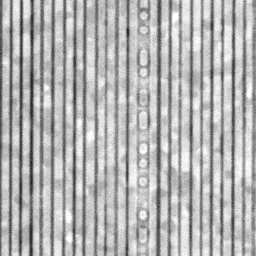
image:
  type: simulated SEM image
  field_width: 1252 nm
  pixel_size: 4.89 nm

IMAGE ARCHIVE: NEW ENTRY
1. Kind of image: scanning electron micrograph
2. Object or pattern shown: parallel lines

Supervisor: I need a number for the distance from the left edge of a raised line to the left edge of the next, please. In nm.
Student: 51.7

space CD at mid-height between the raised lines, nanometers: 17.7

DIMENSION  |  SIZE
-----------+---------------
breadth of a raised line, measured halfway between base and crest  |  7.26 pixels